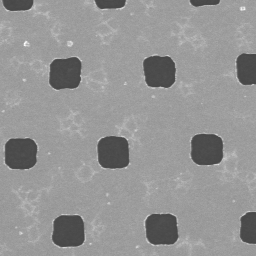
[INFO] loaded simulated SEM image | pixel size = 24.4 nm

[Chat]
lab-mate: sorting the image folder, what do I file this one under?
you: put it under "holes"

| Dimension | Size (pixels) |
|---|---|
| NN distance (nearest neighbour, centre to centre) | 91.2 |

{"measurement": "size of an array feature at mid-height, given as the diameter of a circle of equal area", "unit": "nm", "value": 832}